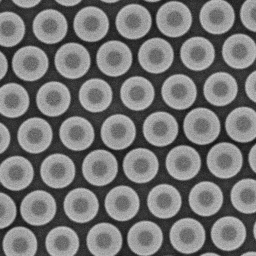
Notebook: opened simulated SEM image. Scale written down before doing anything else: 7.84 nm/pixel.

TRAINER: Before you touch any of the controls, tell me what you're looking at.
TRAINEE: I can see an array of small figures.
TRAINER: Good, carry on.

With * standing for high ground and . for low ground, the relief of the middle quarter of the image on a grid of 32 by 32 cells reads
******...********..********....*
******...*******....******......
*****.....****..................
..*..............***......*****.
......****.....******....*******
.....******....*******...*******
*...********..********...*******
*...********..********...*******
*...********..********...*******
*...********...*******...*******
*....******.....*****......*****
......****........*.............
......................****.....*
..***......*****.....******...**
******....*******...********..**
*******...********..********..**
*******..*********..********..**
*******..*********..********..**
*******...********..********...*
*******...*******....******.....
.*****.....*****.............*..
..**.............****......*****
......******....******....******
*....********..********...******
**...********..********...******
***..********..********...******
***..********..********...******
***..********..********....*****
**...*******....******......****
**....*****.......***...........
*......................****.....
..****......*****.....******....